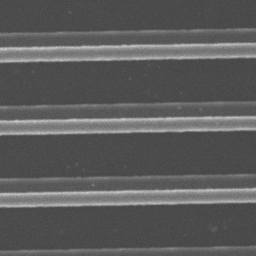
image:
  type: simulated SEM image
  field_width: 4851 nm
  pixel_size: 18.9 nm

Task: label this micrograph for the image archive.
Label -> lines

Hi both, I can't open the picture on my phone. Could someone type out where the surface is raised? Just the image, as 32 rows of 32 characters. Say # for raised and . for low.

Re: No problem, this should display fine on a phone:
................................
................................
................................
................................
################################
################################
################################
##############..................
................................
................................
................................
................................
................................
################################
################################
################################
#################...............
................................
................................
................................
................................
................................
################################
################################
################################
#################...............
................................
................................
................................
................................
................................
################################